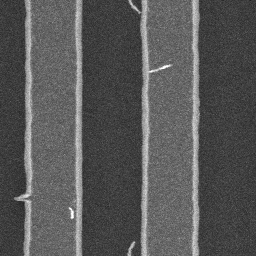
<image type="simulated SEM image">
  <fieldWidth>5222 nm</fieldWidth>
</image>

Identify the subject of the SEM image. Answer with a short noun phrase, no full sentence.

one or a few lines or trenches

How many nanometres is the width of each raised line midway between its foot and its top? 1070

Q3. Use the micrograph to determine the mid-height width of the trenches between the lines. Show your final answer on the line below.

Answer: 64.5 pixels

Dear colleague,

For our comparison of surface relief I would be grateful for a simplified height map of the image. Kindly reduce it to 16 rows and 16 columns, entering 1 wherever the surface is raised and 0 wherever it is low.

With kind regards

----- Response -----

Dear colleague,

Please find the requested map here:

0011100001110000
0011100001110000
0011100001110000
0011100001110000
0011100001110000
0011100001110000
0011100001110000
0011100001110000
0011100001110000
0011100001110000
0011100001110000
0011100001110000
0011100001110000
0011100001110000
0011100001110000
0011100001110000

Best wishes